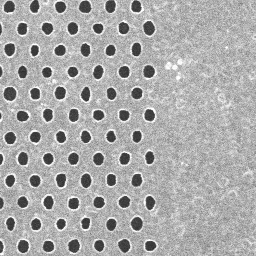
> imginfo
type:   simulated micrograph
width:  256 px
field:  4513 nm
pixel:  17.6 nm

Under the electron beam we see a regular array of holes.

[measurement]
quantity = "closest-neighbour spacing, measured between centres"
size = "0.435 um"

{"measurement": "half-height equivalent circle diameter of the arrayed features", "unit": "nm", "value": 206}